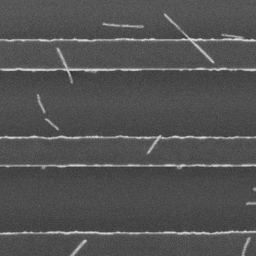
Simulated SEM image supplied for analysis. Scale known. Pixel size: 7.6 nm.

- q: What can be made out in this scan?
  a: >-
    lines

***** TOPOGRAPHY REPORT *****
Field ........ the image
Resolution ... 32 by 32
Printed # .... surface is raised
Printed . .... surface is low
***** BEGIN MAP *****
................................
................................
................................
................................
................................
################################
################################
################################
################################
................................
................................
................................
................................
................................
................................
................................
................................
################################
################################
################################
################################
................................
................................
................................
................................
................................
................................
................................
................................
################################
################################
################################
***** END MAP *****